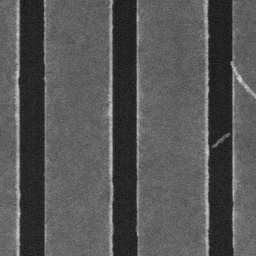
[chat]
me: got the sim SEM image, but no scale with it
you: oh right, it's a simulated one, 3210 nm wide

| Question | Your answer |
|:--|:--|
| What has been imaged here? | lines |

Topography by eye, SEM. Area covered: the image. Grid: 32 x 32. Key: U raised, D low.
UUDDDDUUUUUUUUDDDUUUUUUUUUDDDUUU
UUDDDDUUUUUUUUDDDUUUUUUUUUDDDUUU
UUDDDDUUUUUUUUDDDUUUUUUUUUDDDUUU
UUDDDDUUUUUUUUDDDUUUUUUUUUDDDUUU
UUDDDDUUUUUUUUDDDUUUUUUUUUDDDUUU
UUDDDDUUUUUUUUDDDUUUUUUUUUDDDUUU
UUDDDDUUUUUUUUDDDUUUUUUUUUDDDUUU
UUDDDDUUUUUUUUDDDUUUUUUUUUDDDUUU
UUDDDDUUUUUUUUDDDUUUUUUUUUDDDUUU
UUDDDDUUUUUUUUDDDUUUUUUUUUDDDUUU
UUDDDDUUUUUUUUDDDUUUUUUUUUDDDUUU
UUDDDDUUUUUUUUDDDUUUUUUUUUDDDUUU
UUDDDDUUUUUUUUDDDUUUUUUUUUDDDUUU
UUDDDDUUUUUUUUDDDUUUUUUUUUDDDUUU
UUDDDDUUUUUUUUDDDUUUUUUUUUDDDUUU
UUDDDDUUUUUUUUDDDUUUUUUUUUDDDUUU
UUDDDDUUUUUUUUDDDUUUUUUUUUDDDUUU
UUDDDDUUUUUUUUDDDUUUUUUUUUDDDUUU
UUDDDDUUUUUUUUDDDUUUUUUUUUDDDUUU
UUDDDDUUUUUUUUDDDUUUUUUUUUDDDUUU
UUDDDDUUUUUUUUDDDUUUUUUUUUDDDUUU
UUDDDDUUUUUUUUDDDUUUUUUUUUDDDUUU
UUDDDDUUUUUUUUDDDUUUUUUUUUDDDUUU
UUDDDDUUUUUUUUDDDUUUUUUUUUDDDUUU
UUDDDDUUUUUUUUDDDUUUUUUUUUDDDUUU
UUDDDDUUUUUUUUDDDUUUUUUUUUDDDUUU
UUDDDDUUUUUUUUDDDUUUUUUUUUDDDUUU
UUDDDDUUUUUUUUDDDUUUUUUUUUDDDUUU
UUDDDDUUUUUUUUDDDUUUUUUUUUDDDUUU
UUDDDDUUUUUUUUDDDUUUUUUUUUDDDUUU
UUDDDDUUUUUUUUDDDUUUUUUUUUDDDUUU
UUDDDDUUUUUUUUDDDUUUUUUUUUDDDUUU